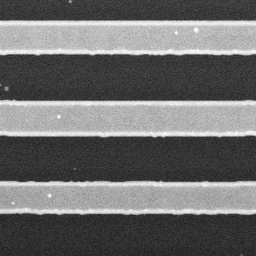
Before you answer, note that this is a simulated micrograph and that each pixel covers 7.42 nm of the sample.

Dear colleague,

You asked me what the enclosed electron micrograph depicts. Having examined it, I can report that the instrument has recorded lines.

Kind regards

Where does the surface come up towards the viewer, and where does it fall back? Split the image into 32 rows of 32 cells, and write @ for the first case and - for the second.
--------------------------------
--------------------------------
--------------------------------
@@@@@@@@@@@@@@@@@@@@@@@@@@@@@@@@
@@@@@@@@@@@@@@@@@@@@@@@@@@@@@@@@
@@@@@@@@@@@@@@@@@@@@@@@@@@@@@@@@
@@@@@@@@@@@@@@@@@@@@@@@@@@@@@@@@
--------------------------------
--------------------------------
--------------------------------
--------------------------------
--------------------------------
--------------------------------
@@@@@@@@@@@@@@@@@@@@@@@@@@@@@@@@
@@@@@@@@@@@@@@@@@@@@@@@@@@@@@@@@
@@@@@@@@@@@@@@@@@@@@@@@@@@@@@@@@
@@@@@@@@@@@@@@@@@@@@@@@@@@@@@@@@
--------------------------------
--------------------------------
--------------------------------
--------------------------------
--------------------------------
--------------------------------
@@@@@@@@@@@@@@@@@@@@@@@@@@@@@@@@
@@@@@@@@@@@@@@@@@@@@@@@@@@@@@@@@
@@@@@@@@@@@@@@@@@@@@@@@@@@@@@@@@
@@@@@@@@@@@@@@@@@@@@@@@@@@@@@@@@
--------------------------------
--------------------------------
--------------------------------
--------------------------------
--------------------------------